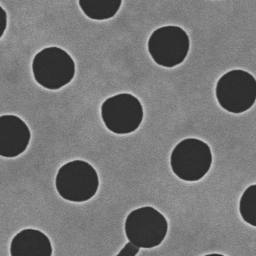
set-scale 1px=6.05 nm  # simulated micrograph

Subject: holes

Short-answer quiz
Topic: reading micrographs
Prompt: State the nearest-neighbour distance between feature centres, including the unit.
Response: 0.497 um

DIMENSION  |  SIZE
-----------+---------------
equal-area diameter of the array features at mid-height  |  252 nanometers